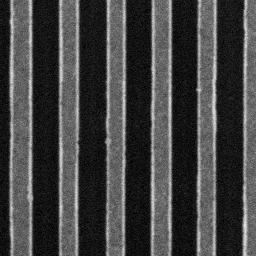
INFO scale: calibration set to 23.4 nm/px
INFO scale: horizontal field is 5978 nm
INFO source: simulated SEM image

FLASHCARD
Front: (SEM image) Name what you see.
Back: lines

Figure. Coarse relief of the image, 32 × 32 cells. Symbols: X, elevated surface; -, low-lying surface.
-XXX---XXX---XXX---XX----XX----X
-XXX---XXX---XXX---XX----XX----X
-XXX---XXX---XXX---XX----XX----X
-XXX---XXX---XXX---XX----XX----X
-XXX---XXX---XXX---XX----XX----X
-XXX---XXX---XXX---XX----XX----X
-XXX---XXX---XXX---XX----XX----X
-XXX---XXX---XXX---XX----XX----X
-XXX---XXX---XXX---XX----XX----X
-XXX----XX---XXX---XX----XX----X
-XXX---XXX---XXX---XX----XX----X
-XXX---XXX---XXX---XX----XX----X
-XXX---XXX---XXX---XX----XX----X
-XXX---XXX---XXX---XX----XX----X
-XXX---XXX---XXX---XX----XX----X
-XXX---XXX---XXX---XX----XX----X
-XXX---XXX---XXX---XX----XX----X
-XXX---XXX---XXX---XX----XX----X
-XXX---XXX---XXX---XX----XX----X
-XXX---XXX---XXX---XX----XX----X
-XXX---XXX---XXX---XX----XX----X
-XXX---XXX---XXX---XX----XX----X
-XXX---XXX---XXX---XX----XX----X
-XXX---XXX---XXX---XX----XX----X
-XXX---XXX---XXX---XX----XX----X
-XXX---XXX---XXX---XX----XX----X
-XXX---XXX---XXX---XX----XX----X
-XXX---XXX---XXX---XX----XX----X
-XXX---XXX---XXX---XX----XX----X
-XXX---XXX---XXX---XX----XX----X
-XXX---XXX---XXX---XX----XX----X
-XXX---XXX---XXX---XX----XX----X